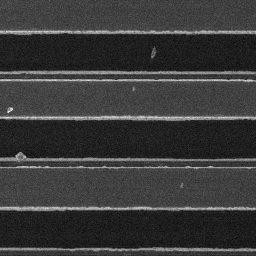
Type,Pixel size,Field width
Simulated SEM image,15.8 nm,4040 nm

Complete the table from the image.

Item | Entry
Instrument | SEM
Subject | lines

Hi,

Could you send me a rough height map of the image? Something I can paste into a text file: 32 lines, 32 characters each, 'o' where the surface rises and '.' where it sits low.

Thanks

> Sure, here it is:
oooooooooooooooooooooooooooooooo
oooooooooooooooooooooooooooooooo
oooooooooooooooooooooooooooooooo
oooooooooooooooooooooooooooooooo
................................
................................
................................
................................
................................
oooooooooooooooooooooooooooooooo
oooooooooooooooooooooooooooooooo
oooooooooooooooooooooooooooooooo
oooooooooooooooooooooooooooooooo
oooooooooooooooooooooooooooooooo
oooooooooooooooooooooooooooooooo
................................
................................
................................
................................
..o.............................
oooooooooooooooooooooooooooooooo
oooooooooooooooooooooooooooooooo
oooooooooooooooooooooooooooooooo
oooooooooooooooooooooooooooooooo
oooooooooooooooooooooooooooooooo
oooooooooooooooooooooooooooooooo
................................
................................
................................
................................
................................
oooooooooooooooooooooooooooooooo